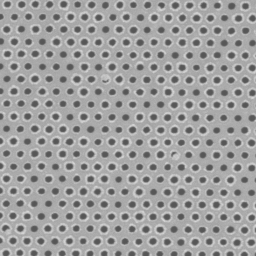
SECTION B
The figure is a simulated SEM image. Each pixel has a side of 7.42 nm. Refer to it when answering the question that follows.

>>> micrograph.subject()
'a regular array of holes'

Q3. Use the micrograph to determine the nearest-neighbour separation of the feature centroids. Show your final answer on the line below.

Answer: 0.102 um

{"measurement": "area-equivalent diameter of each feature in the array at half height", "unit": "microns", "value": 0.0495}